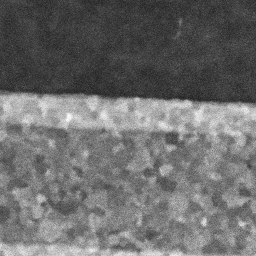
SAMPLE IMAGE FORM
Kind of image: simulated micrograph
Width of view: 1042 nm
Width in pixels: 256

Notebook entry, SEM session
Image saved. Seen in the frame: one or a few lines or trenches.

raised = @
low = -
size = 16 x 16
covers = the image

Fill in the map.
----------------
----------------
----------------
----------------
----------------
----------------
----------------
@@@@@@@@@@@@@@@-
@@@@@@@@@@@@@@@@
@@@@@@@@@@@@@@@@
@@@@@@@@@@@@@@@@
@@@@@@@@@@@@@@@@
@@@@@@@@@@@@@@@@
@@@@@@@@@@@@@@@@
@@@@@@@@@@@@@@@@
@@@@@@@@@@@@@@@@